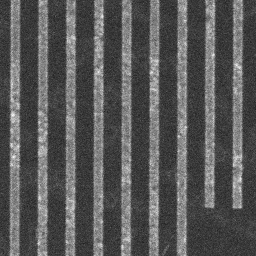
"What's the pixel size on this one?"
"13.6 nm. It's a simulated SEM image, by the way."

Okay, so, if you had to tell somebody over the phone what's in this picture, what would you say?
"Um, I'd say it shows parallel lines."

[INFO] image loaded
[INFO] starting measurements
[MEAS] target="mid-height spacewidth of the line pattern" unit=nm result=266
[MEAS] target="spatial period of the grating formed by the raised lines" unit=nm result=379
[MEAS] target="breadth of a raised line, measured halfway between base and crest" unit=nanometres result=114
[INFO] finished